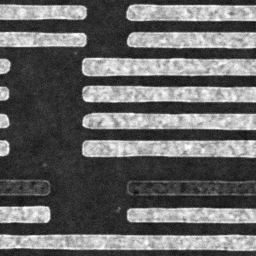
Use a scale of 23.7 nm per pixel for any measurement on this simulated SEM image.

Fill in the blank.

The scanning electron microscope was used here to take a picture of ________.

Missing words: wiring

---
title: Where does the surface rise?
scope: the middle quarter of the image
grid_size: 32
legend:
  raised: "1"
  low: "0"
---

00000111111111111111111111111111
00000111111111111111111111111111
00000111111111111111111111111111
00000000000000000000000000000000
00000000000000000000000000000000
00000000000000000000000000000000
00000111111111111111111111111111
00000111111111111111111111111111
00000111111111111111111111111111
00000000000000000000000000000000
00000000000000000000000000000000
00000000000000000000000000000000
00000001111111111100000000000000
00000111111111111111111111111111
00000111111111111111111111111111
00000111111111111111111111111111
00000000000000000000000000000000
00000000000000000000000000000000
00000000000000000000000000000000
00000111111111111111111111111111
00000111111111111111111111111111
00000111111111111111111111111111
00000111111111111111111111111111
00000000000000000000000000000000
00000000000000000000000000000000
00000000000000000000000000000000
00000000000000000000000000000000
00000000000000000000000000000000
00000000000000000000000000000000
00000000000000001111111111111111
00000000000000001111111111111111
00000000000000001111111111111111